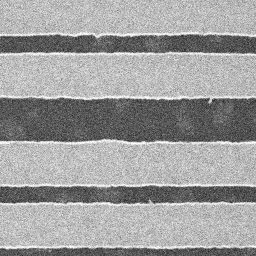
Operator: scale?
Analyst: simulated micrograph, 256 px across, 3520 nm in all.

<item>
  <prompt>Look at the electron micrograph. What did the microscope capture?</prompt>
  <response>one or a few lines or trenches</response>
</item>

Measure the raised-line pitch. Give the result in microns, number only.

1.03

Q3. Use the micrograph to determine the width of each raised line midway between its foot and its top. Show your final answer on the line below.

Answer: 43.1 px